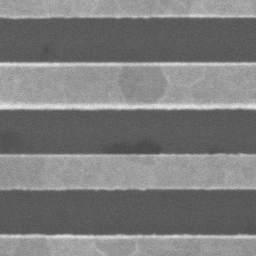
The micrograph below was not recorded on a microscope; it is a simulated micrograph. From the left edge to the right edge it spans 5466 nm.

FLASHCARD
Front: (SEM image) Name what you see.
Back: lines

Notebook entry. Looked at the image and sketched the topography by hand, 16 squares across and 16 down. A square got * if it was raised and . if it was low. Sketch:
****************
................
................
................
****************
****************
****************
................
................
................
****************
****************
................
................
................
****************